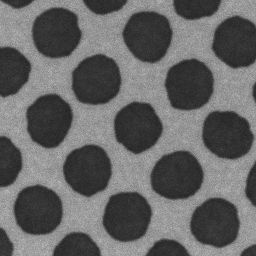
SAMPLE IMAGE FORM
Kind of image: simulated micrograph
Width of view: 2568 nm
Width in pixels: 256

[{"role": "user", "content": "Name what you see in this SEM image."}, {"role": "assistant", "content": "a regular array of holes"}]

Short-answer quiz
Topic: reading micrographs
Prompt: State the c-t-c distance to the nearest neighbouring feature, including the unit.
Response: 622 nm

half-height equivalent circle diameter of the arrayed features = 504 nm